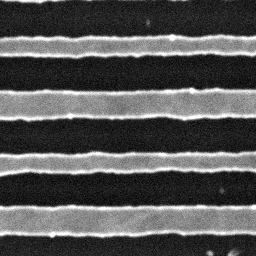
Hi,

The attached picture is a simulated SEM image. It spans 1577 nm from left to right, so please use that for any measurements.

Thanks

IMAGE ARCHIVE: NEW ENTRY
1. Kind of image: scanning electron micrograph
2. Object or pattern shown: lines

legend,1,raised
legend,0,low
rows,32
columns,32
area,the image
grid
00000000000000000000000000000000
00000000000000000000000000000000
00000000000000000000000000000000
00000000000000000000000000000000
00000000000000000000010000010000
11111111111111111111111111111111
11111111111111111111111111111111
00000000000000000000000000000000
00000000000000000000000000000000
00000000000000000000000000000000
00000000000000000000000000000000
11001111110000000111111111111111
11111111111111111111111111111111
11111111111111111111111111111111
11111111111111111111011111111111
00000000000000000000000000000000
00000000000000000000000000000000
00000000000000000000000000000000
00000000000000000000000000000000
11111111111111111111111111111111
11111111111111111111111111111111
11100111111100111000000000000000
00000000000000000000000000000000
00000000000000000000000000000000
00000000000000000000000000000000
00000000000000000000000000000000
11111111111111111111111111111111
11111111111111111111111111111111
11111111111111111111111111111111
00000000000010000000000000000000
00000000000000000000000000000000
00000000000000000000000000000000